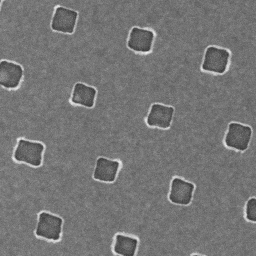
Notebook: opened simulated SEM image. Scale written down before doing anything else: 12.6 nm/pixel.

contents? a regular array of holes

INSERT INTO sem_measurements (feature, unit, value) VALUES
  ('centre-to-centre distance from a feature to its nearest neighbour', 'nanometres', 978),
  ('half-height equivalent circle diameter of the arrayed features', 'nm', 326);